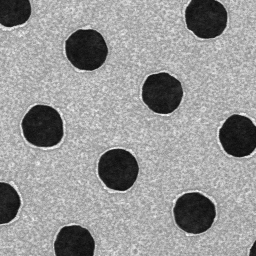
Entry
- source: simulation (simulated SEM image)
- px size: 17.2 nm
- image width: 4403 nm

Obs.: holes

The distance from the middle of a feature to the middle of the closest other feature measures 1.5 microns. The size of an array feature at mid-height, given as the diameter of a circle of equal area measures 720 nm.